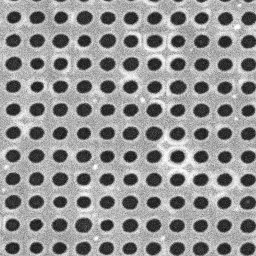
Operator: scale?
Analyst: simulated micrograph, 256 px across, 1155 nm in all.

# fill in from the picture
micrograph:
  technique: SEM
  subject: a regular array of holes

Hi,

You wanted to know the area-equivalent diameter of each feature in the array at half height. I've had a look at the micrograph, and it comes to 66.5 nanometers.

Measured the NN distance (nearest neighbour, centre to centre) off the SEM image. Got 0.103 microns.